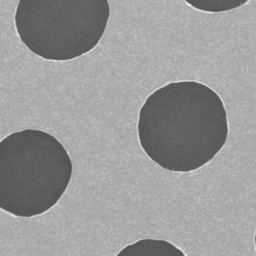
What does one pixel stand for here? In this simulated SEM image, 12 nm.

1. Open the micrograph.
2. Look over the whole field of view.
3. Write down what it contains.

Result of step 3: holes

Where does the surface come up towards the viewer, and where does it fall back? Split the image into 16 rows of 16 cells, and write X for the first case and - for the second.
X------XXXXX---X
X------XXXXXXXXX
X-----XXXXXXXXXX
XX---XXXXXXXXXXX
XXXXXXXXXXXXXXXX
XXXXXXXXXX---XXX
XXXXXXXXX-----XX
XXXXXXXXX-----XX
X--XXXXXX-----XX
----XXXXX-----XX
----XXXXXX--XXXX
----XXXXXXXXXXXX
----XXXXXXXXXXXX
X-XXXXXXXXXXXXXX
XXXXXXXXXXXXXXXX
XXXXXXXX---XXXXX